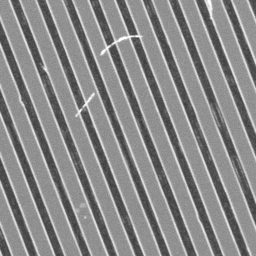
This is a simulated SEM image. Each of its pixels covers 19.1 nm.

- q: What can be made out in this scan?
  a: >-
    parallel lines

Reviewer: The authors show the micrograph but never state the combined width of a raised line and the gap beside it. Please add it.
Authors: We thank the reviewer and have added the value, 471 nm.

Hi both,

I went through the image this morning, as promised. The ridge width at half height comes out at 298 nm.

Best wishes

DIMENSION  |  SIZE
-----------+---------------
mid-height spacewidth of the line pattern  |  176 nanometres